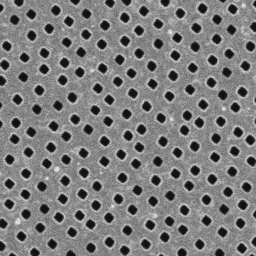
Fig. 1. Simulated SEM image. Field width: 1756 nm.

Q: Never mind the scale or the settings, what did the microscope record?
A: a regular array of holes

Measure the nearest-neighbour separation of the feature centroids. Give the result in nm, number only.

124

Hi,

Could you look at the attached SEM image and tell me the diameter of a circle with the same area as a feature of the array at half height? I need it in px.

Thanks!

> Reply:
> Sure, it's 9.56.